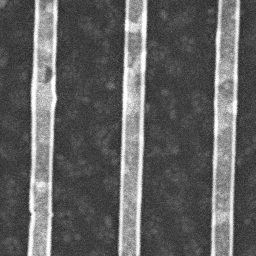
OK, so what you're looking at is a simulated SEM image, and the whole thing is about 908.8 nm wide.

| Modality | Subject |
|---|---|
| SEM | one or a few lines or trenches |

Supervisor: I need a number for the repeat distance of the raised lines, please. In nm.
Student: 323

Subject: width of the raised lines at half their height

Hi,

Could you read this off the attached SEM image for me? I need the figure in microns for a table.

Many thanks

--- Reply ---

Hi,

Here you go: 0.0661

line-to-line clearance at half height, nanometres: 256